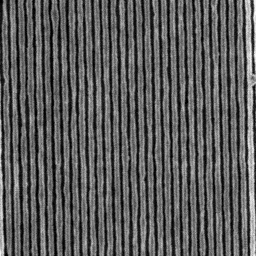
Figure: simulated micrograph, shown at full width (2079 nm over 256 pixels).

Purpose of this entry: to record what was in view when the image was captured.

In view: parallel lines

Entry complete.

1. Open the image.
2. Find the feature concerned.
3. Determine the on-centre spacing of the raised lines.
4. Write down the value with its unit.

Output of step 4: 0.0682 um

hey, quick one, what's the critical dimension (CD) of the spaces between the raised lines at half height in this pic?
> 3.62 px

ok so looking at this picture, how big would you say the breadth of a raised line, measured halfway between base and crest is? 4.37 pixels